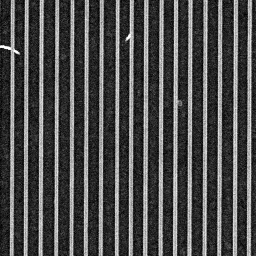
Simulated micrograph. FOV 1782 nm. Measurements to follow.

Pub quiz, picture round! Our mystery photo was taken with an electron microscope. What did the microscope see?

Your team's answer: parallel lines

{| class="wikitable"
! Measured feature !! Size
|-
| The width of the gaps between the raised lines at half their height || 80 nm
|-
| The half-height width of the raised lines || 20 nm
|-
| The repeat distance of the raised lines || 0.103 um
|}